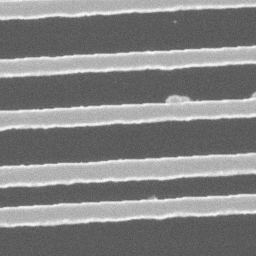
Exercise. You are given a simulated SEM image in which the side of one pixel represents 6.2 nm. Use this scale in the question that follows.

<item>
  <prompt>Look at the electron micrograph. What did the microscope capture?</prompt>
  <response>lines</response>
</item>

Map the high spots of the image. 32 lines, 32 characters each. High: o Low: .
oooooooooooooooooooooooooooooooo
oooooooooooooooo................
................................
................................
................................
................................
..................oooooooooooooo
oooooooooooooooooooooooooooooooo
oooooooooooooooooooooo..........
................................
................................
................................
..............................oo
.........ooooooooooooooooooooooo
ooooooooooooooooooooooooooooooo.
ooooooooooooo...................
................................
................................
................................
..........................oooooo
.......ooooooooooooooooooooooooo
oooooooooooooooooooooooooooooo..
oooooooooooooooo................
................................
............................oooo
.......ooooooooooooooooooooooooo
oooooooooooooooooooooooooooooooo
ooooooooooooooo.................
................................
................................
................................
................................